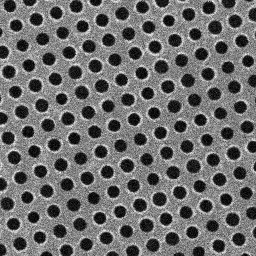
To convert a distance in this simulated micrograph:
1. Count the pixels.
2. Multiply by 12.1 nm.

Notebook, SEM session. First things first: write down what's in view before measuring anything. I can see a regular array of holes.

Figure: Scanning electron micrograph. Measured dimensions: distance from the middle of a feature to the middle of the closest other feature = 0.25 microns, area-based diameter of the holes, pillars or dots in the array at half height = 0.154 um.